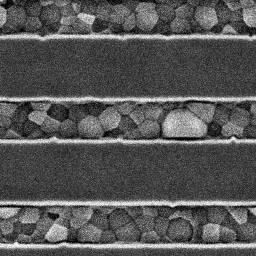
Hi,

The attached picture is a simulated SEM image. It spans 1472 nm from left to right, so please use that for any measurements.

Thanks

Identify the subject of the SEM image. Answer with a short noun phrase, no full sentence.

one or a few lines or trenches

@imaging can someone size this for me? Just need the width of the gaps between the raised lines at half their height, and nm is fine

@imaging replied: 240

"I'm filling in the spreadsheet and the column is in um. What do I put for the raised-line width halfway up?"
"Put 0.359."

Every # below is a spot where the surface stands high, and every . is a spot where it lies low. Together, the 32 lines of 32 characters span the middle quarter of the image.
################################
################################
################################
################################
################################
################################
################################
################################
################################
................................
................................
................................
................................
................................
............................####
...........................#####
...........................#####
...........................#####
................................
################################
################################
################################
################################
################################
################################
################################
################################
################################
################################
################################
################################
################################